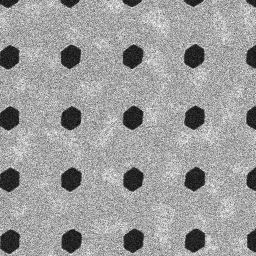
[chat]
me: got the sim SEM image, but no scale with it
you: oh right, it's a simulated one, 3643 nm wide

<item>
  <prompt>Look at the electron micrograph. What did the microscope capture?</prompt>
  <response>a regular array of holes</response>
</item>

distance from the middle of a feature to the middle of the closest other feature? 61.2 pixels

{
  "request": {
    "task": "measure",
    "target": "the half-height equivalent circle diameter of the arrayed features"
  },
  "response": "316 nm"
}